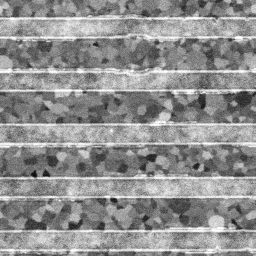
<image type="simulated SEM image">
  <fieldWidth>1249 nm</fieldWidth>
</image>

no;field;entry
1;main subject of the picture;parallel lines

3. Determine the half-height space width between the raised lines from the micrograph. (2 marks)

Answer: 92.7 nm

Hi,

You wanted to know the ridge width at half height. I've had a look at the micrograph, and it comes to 166 nm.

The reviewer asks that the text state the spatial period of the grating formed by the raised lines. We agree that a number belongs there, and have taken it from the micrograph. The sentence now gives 260 nm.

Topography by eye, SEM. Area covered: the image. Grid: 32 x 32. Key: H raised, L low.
HHHHHHHHHHHHHHHHHHHHHHHHHHHHHHHH
HHHHHHHHHHHHHHHHHHHHHHHHHHHHHHHH
LLLLLLLLLLLLLLLLLLLLLLLLLLLLLLLL
LLLLLLLLLLLLLLLLLLLLLLLLLLLLLLLL
LLLLLLLLLLLLLLLHHHLLLLLLLLLLLLLL
HHHHHHHHHHHHHHHHHHHHHHHHHHHHHHHH
HHHHHHHHHHHHHHHHHHHHHHHHHHHHHHHH
HHHHHHHHHHHHHHHHHHHHHHHHHHHHHHHH
HHHHHHHHHHHHHHHHHHHHHHHHHHHHHHHH
LLLLLLLLLLLLLLLLLLLLLLLLLLLLLLLL
LLLLLLLLLLLLLLLLLLLLLLLLLLLLLLLL
HHHHHHHHHHHHHHHHHHHHHHHHHHHHHHHH
HHHHHHHHHHHHHHHHHHHHHHHHHHHHHHHH
HHHHHHHHHHHHHHHHHHHHHHHHHHHHHHHH
HHHHHHHHHHHHHHHHHHHHHHHHHHHHHHHH
HHHHHHHHLLLLLLLLLLLLLLLLLLLLLLLL
LLLLLLLLLLLLLLLLLLLLLLLLLLLLLLLL
LLLLLLLLLLLLLLLLLLLLLLLLLLLLLLLL
HHHHHHHHHHHHHHHHHHHHHHHHHHHHHHHH
HHHHHHHHHHHHHHHHHHHHHHHHHHHHHHHH
HHHHHHHHHHHHHHHHHHHHHHHHHHHHHHHH
HHHHHHHHHHHHHHHHHHHHHHHHHHHHHHHH
LLLLLLLLLLLLLLLLLLLLLLLLLLLLLLLL
LLLLLLLLLLLLLLLLLLLLLLLLLLLLLLLL
LLLLLLLLLLLLLLLLLLLLLLLLLLLLLLLL
HHHHHHHHHHHHHHHHHHHHHHHHHHHHHHHH
HHHHHHHHHHHHHHHHHHHHHHHHHHHHHHHH
HHHHHHHHHHHHHHHHHHHHHHHHHHHHHHHH
HHHHHHHHHHHHHHHHHHHHHHHHHHHHHHHH
LLLLLLLLLLLLLLLLLLLLLLLLLLLLLLLL
LLLLLLLLLLLLLLLLLLLLLLLLLLLLLLLL
HHHHHHHHHHHHHHHHHHHHHHHHHHHHHHHH